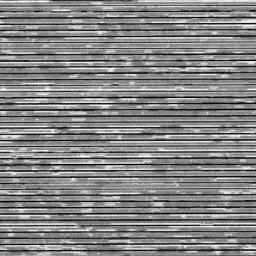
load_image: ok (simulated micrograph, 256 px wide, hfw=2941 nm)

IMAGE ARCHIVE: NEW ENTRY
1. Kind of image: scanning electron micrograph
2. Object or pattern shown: parallel lines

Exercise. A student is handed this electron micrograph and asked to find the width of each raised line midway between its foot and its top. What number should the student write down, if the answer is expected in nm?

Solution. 51.7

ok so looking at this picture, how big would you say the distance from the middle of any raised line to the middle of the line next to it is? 70.2 nanometers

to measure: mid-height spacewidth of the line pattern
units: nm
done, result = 20.1